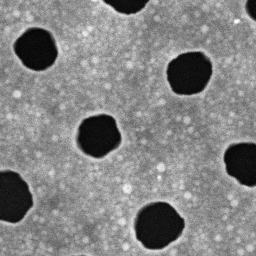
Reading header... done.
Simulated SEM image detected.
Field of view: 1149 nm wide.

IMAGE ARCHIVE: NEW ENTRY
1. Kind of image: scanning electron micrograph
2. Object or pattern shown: holes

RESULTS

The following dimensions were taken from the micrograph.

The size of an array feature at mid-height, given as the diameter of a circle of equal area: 197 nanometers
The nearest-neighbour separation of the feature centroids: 482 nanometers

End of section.